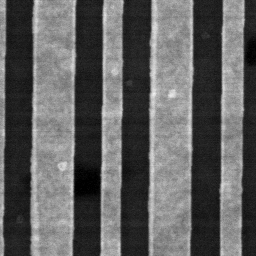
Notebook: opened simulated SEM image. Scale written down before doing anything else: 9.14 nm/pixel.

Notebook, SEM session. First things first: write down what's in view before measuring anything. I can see lines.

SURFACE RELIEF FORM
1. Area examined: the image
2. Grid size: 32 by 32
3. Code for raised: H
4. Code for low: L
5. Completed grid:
HLLLHHHHHLLLLHHLLLLHHHHHLLLLHHLL
HLLLHHHHHLLLLHHLLLLHHHHHLLLLHHLL
HLLLHHHHHLLLLHHLLLLHHHHHLLLLHHLL
HLLLHHHHHLLLLHHLLLLHHHHHLLLLHHLL
HLLLHHHHHLLLLHHLLLLHHHHHLLLLHHLL
HLLLHHHHHLLLLHHLLLLHHHHHLLLLHHLL
HLLLHHHHHLLLLHHLLLLHHHHHLLLLHHLL
HLLLHHHHHLLLLHHLLLLHHHHHLLLLHHLL
HLLLHHHHHLLLLHHLLLLHHHHHLLLLHHLL
HLLLHHHHHLLLLHHLLLLHHHHHLLLLHHLL
HLLLHHHHHLLLLHHLLLLHHHHHLLLLHHLL
HLLLHHHHHLLLLHHLLLLHHHHHLLLLHHLL
HLLLHHHHHLLLLHHLLLLHHHHHLLLLHHLL
HLLLHHHHHLLLLHHLLLLHHHHHLLLLHHLL
HLLLHHHHHLLLLHHLLLLHHHHHLLLLHHLL
HLLLHHHHHLLLLHHLLLLHHHHHLLLLHHLL
HLLLHHHHHLLLLHHLLLLHHHHHLLLLHHLL
HLLLHHHHHLLLLHHLLLLHHHHHLLLLHHLL
HLLLHHHHHLLLLHHLLLLHHHHHLLLLHHLL
LLLLHHHHHLLLLHHLLLLHHHHHLLLLHHLL
LLLLHHHHHLLLLHHLLLLHHHHHLLLLHHLL
LLLLHHHHHLLLLHHLLLLHHHHHLLLLHHLL
LLLLHHHHHLLLLHHLLLLHHHHHLLLLHHLL
LLLLHHHHHLLLLHHLLLLHHHHHLLLLHHLL
LLLLHHHHHLLLLHHLLLLHHHHHLLLLHHLL
LLLLHHHHHLLLLHHLLLLHHHHHLLLLHHLL
LLLLHHHHHLLLLHHLLLLHHHHHLLLLHHLL
LLLLHHHHHLLLLHHLLLLHHHHHLLLLHHLL
LLLLHHHHHLLLLHHLLLLHHHHHLLLLHHLL
LLLLHHHHHLLLLHHLLLLHHHHHLLLLHHLL
LLLLHHHHHLLLLHHLLLLHHHHHLLLLHHLL
LLLLHHHHHLLLLHHLLLLHHHHHLLLLHHLL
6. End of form